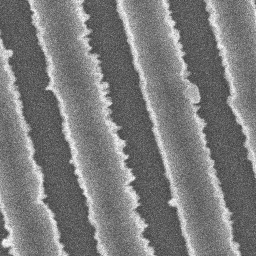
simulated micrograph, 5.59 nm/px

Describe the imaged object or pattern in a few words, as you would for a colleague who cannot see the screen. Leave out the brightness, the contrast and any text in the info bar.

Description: one or a few lines or trenches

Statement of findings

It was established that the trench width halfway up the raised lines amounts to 216 nm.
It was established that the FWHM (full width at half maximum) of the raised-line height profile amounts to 253 nanometres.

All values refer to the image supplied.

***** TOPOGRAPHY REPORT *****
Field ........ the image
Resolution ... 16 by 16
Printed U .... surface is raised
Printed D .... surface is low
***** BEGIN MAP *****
DDUUUDDDUUDDDUUU
DDUUUDDDUUUDDUUU
DDDUUDDDUUUDDDUU
UDDUUUDDUUUDDDUU
UDDUUUDDDUUUDDUU
UDDUUUDDDUUUDDUU
UDDDUUUDDUUUDDUU
UDDDUUUDDDUUDDDU
UUDDUUUDDDUUUDDU
UUDDDUUUDDUUUDDD
UUDDDUUUDDUUUDDD
UUUDDUUUDDDUUUDD
UUUDDUUUDDDUUUDD
UUUDDDUUUDDUUUDD
DUUUDDUUUDDDUUDD
DUUUDDUUUDDDUUUD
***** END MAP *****